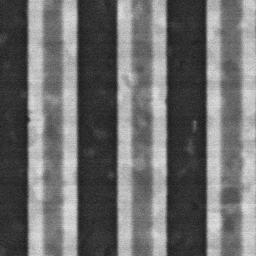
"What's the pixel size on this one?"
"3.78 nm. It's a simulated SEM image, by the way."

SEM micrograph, one or a few lines or trenches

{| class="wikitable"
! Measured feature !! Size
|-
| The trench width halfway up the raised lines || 0.206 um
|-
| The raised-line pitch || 0.338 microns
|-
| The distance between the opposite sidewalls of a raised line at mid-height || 130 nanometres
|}